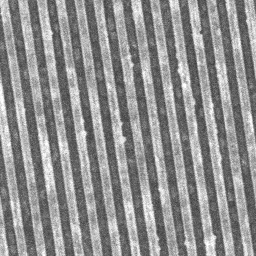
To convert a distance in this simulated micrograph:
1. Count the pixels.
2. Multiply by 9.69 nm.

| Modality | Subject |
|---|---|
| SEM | parallel lines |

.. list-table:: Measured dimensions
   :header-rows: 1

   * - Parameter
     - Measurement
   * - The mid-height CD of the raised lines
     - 8.4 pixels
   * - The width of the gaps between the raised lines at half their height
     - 102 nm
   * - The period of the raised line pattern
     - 180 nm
